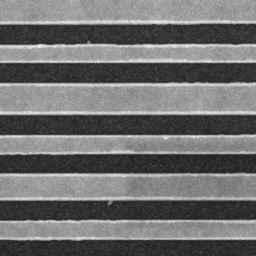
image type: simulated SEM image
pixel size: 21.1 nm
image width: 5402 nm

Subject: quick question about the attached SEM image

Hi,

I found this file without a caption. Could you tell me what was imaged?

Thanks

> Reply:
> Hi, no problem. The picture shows lines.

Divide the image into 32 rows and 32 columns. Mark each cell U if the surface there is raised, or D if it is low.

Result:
UUUUUUUUUUUUUUUUUUUUUUUUUUUUUUUU
UUUUUUUUUUUUUUUUUUUUUUUUUUUUUUUU
UUUUUUUUUUUUUUUUUUUUUUUUUUUUUUUU
DDDDDDDDDDDDDDDDDDDDDDDDDDDDDDDD
DDDDDDDDDDDDDDDDDDDDDDDDDDDDDDDD
DDDDDDDDDDDDDDDDDDDDDDDDDDDDDDDD
UUUUUUUUUUUUUUUUUUUUUUUUUUUUUUUU
UUUUUUUUUUUUUUUUUUUUUUUUUUUUUUUU
DDDDDDDDDDDDDDDDDDDDDDDDDDDDDDDD
DDDDDDDDDDDDDDDDDDDDDDDDDDDDDDDD
UUUUUUUUUUUUUUUUUUUUUUUUUUUUUUUU
UUUUUUUUUUUUUUUUUUUUUUUUUUUUUUUU
UUUUUUUUUUUUUUUUUUUUUUUUUUUUUUUU
UUUUUUUUUUUUUUUUUUUUUUUUUUUUUUUU
DDDDDDDDDDDDDDDDDDDDDDDDDDDDDDDD
DDDDDDDDDDDDDDDDDDDDDDDDDDDDDDDD
DDDDDDDDDDDDDDDDDDDDDDDDDDDDDDDD
UUUUUUUUUUUUUUUUUUUUUUUUUUUUUUUU
UUUUUUUUUUUUUUUUUUUUUUUUUUUUUUUU
DDDDDDDDDDDDDDDDDDDDDDDDDDDDDDDD
DDDDDDDDDDDDDDDDDDDDDDDDDDDDDDDD
DDDDDDDDDDDDDDDDDDDDDDDDDDDDDDDD
UUUUUUUUUUUUUUUUUUUUUUUUUUUUUUUU
UUUUUUUUUUUUUUUUUUUUUUUUUUUUUUUU
UUUUUUUUUUUUUUUUUUUUUUUUUUUUUUUU
DDDDDDDDDDDDDDDDDDDDDDDDDDDDDDDD
DDDDDDDDDDDDDDDDDDDDDDDDDDDDDDDD
DDDDDDDDDDDDDDDDDDDDDDDDDDDDDDDD
UUUUUUUUUUUUUUUUUUUUUUUUUUUUUUUU
UUUUUUUUUUUUUUUUUUUUUUUUUUUUUUUU
DDDDDDDDDDDDDDDDDDDDDDDDDDDDDDDD
DDDDDDDDDDDDDDDDDDDDDDDDDDDDDDDD